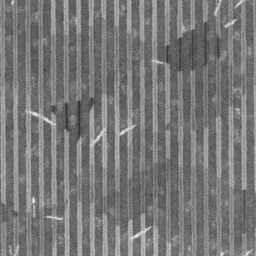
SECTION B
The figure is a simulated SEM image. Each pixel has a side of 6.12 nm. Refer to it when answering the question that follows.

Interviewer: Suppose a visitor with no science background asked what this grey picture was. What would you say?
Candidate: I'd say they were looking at parallel lines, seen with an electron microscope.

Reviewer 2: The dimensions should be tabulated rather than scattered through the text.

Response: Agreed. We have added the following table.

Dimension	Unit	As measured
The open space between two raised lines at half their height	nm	61.9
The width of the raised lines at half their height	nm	15.3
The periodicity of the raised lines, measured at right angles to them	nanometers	77.5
